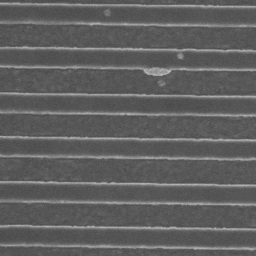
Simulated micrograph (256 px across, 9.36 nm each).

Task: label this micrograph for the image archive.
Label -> lines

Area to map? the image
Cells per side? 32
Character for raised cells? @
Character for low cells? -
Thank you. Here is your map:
@@@-----------------------------
@@@@@@@@@@@@@@@@@@@@@@@@@@@@@@@@
@@@@@@@@@@@@@@@@@@@@@@@@@@@@@@@@
--------------------------------
--------------------------------
--------------------------------
@@@@@@@@@@@@@@@@@@@@@@@@@@@@@@@@
@@@@@@@@@@@@@@@@@@@@@@@@@@@@@@@@
-----------@@@@@@@@@@@@@@@@@@@@@
--------------------------------
--------------------------------
--------------------------------
@@@@@@@@@@@@@@@@@@@@@@@@@@@@@@@@
@@@@@@@@@@@@@@@@@@@@@@@@@@@@@@@@
------------------------------@-
--------------------------------
--------------------------------
@@@@@@@@@@@@@@@@@@@@@@@@@@@@----
@@@@@@@@@@@@@@@@@@@@@@@@@@@@@@@@
@@@@@@@@@@@@@@@@@@@@@@@@@@@@@@@@
--------------------------------
--------------------------------
--------------------------------
@@@@@@@@@@@@@@@@@@@@@@@@@@@@@@@@
@@@@@@@@@@@@@@@@@@@@@@@@@@@@@@@@
-----------------------@@@@@@@@@
--------------------------------
--------------------------------
@@@@@@@@@@@@@@@@@@@@@@----------
@@@@@@@@@@@@@@@@@@@@@@@@@@@@@@@@
@@@@@@@@@@@@@@@@@@@@@@@@@@@@@@@@
--------------------------------